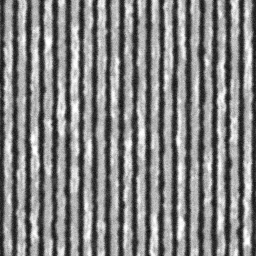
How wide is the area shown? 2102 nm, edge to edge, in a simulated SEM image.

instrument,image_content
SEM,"parallel lines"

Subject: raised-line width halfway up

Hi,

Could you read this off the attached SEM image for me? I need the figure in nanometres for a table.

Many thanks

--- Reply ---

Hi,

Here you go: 53.4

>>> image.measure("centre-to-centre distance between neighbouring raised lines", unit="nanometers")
109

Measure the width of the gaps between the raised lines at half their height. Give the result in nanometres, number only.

53.4